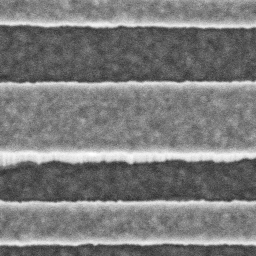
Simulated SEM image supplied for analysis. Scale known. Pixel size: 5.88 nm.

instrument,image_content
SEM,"lines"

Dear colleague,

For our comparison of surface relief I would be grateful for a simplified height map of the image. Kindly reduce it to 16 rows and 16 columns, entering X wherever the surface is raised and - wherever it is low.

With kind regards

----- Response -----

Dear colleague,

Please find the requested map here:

XXXXXXXXXXXXXXXX
X-XXXXXXXXXXXXXX
----------------
----------------
----------------
XXXXXXXXXXXXXXXX
XXXXXXXXXXXXXXXX
XXXXXXXXXXXXXXXX
XXXXXXXXXXXXXXXX
XXXXXXXXXXXXXXXX
----------------
----------------
----------------
XXXXXXXXXXXXXXXX
XXXXXXXXXXXXXXXX
----------------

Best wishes